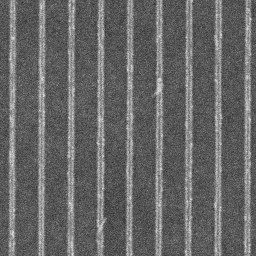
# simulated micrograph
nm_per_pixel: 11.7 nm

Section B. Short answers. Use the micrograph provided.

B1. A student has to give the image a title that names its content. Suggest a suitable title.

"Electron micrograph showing parallel lines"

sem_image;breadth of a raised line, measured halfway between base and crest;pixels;4.87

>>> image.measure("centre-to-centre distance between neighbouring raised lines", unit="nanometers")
344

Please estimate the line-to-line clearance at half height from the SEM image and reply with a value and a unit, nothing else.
24.4 pixels